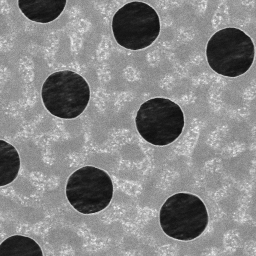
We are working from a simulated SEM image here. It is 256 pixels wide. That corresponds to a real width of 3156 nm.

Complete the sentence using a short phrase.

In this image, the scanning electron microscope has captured holes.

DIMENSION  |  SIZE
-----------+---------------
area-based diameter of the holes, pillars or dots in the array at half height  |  592 nm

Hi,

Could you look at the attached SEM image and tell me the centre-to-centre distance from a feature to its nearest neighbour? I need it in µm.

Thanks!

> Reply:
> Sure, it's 1.21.